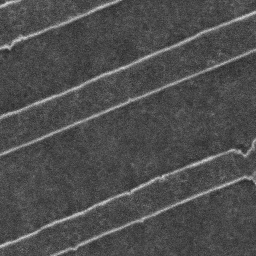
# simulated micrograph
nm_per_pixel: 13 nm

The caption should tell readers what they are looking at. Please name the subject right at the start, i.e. one or a few lines or trenches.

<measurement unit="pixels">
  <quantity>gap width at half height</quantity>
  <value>81.9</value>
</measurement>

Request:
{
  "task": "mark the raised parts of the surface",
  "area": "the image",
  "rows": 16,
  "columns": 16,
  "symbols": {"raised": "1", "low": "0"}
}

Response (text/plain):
1111110000000000
1111000000000011
1000000000001111
0000000001111110
0000000111111000
0000011111000000
0011111100000000
1111100000000000
1110000000000000
0000000000000011
0000000000001111
0000000001111100
0000000111110000
0000011110000000
0011111000000000
1111100000000000